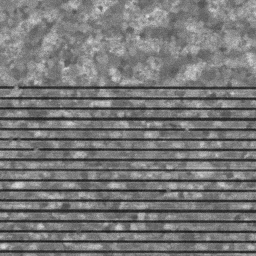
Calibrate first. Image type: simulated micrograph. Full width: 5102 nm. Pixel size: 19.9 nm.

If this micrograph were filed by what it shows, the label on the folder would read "parallel lines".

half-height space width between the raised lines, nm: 72.3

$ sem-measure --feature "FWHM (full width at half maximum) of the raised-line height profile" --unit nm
144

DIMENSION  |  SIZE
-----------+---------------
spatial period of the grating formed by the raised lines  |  204 nanometers